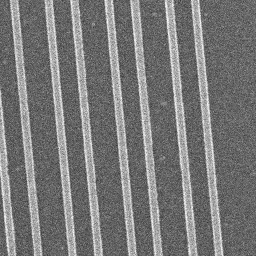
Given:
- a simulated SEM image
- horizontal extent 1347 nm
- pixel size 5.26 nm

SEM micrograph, parallel lines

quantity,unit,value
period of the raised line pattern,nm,157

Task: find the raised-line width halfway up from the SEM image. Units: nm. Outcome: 37.3